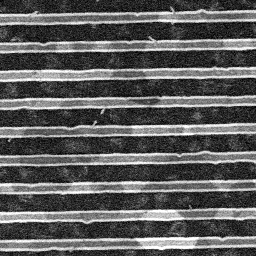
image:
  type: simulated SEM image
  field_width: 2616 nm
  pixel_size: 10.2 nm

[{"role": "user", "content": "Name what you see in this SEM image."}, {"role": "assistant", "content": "parallel lines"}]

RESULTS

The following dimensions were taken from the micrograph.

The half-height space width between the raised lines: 199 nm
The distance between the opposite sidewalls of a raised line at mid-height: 0.0894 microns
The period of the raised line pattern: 289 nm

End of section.